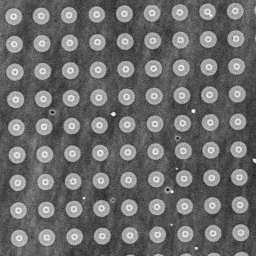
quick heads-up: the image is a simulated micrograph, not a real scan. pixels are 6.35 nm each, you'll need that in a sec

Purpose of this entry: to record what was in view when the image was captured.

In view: an array of small figures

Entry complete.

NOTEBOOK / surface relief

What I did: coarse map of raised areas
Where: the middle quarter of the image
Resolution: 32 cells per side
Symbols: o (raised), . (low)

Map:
ooo....ooo....ooo...oooo...oooo.
oooo...ooo....ooo...oooo...oooo.
oooo...ooo....ooo....ooo....ooo.
.oo.............................
................................
................................
........o......oo....ooo....ooo.
oooo...oooo...oooo...oooo...ooo.
oooo...oooo...oooo...oooo...ooo.
oooo...ooo....ooo....ooo....ooo.
.oo.............................
................................
............o...................
........oo.....oo....ooo....ooo.
oooo...oooo...oooo...oooo...oooo
oooo...oooo...oooo...oooo...oooo
oooo...ooo....ooo....ooo.....oo.
................................
................................
................................
........oo.....oo....ooo....oooo
oooo...oooo...oooo...oooo...oooo
oooo...oooo...oooo...oooo...oooo
oooo...oooo....oo.....oo.....oo.
................................
................................
................................
..o.....oo.....ooo....ooo...oooo
oooo...oooo...oooo...oooo...oooo
oooo...oooo...oooo...oooo...oooo
.ooo....ooo....oo.....oo.....oo.
................................